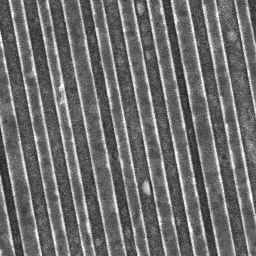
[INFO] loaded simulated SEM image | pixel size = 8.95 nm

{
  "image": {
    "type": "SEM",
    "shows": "parallel lines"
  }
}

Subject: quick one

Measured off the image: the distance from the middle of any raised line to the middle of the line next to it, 0.244 microns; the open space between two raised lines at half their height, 123 nm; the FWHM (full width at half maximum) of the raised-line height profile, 132 nm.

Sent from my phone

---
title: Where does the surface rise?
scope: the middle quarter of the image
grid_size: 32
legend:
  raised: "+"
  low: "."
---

...++++...+++....+++....+++...++
...++++...+++....++++...++++..++
...++++...+++....++++...++++..++
...++++...+++....++++...++++..++
...++++...+++....++++...++++..++
....++++...++.....+++....+++...+
....++++...+++....+++....+++...+
....++++...+++....++++...++++..+
....++++...+++....++++...++++..+
+...++++...+++....++++...++++..+
+...+++++..+++.....+++....+++...
+....++++...+++....+++....+++...
+....++++...+++....++++...++++..
+....++++...+++....++++...++++..
++...++++...+++....++++...++++..
++...+++++..+++....++++...++++..
++....++++...+++....+++....+++..
++....++++...+++....+++....++++.
++....++++...+++....++++...++++.
++....++++...+++....++++...++++.
+++...++++...+++....++++...++++.
+++...+++++...++.....+++....+++.
+++....++++...+++....+++....+++.
.++....++++...+++....++++...++++
.++....++++...+++....++++...++++
.+++...++++...+++....++++...++++
.+++...+++++..+++....++++....+++
.+++....++++...+++....+++....+++
..++....++++...+++....++++...+++
..++....++++...+++....++++...+++
..+++...++++...+++....++++...+++
..+++...+++++..+++....++++...+++